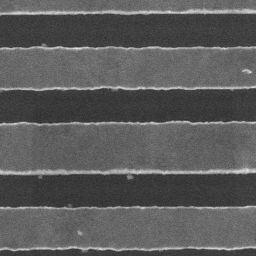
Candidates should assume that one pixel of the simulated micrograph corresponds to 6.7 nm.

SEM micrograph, lines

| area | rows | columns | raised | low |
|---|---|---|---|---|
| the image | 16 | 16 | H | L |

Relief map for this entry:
HHHHHHHHHHHHHHHH
LLLLLLLLLLLLLLLL
LLLLLLLLLLLLLLLL
HHHHHHHHHHHHHHHH
HHHHHHHHHHHHHHHH
HHHHHHHHHHHHHHHH
LLLLLLLLLLLLLLLL
LLLLLLLLLLLLLLLL
HHHHHHHHHHHHHHHH
HHHHHHHHHHHHHHHH
HHHHHHHHHHHHHHHH
LLLLLLLLLLLLLLLL
LLLLLLLLLLLLLLLL
HHHHHHHHHHHHHHHH
HHHHHHHHHHHHHHHH
HHHHHHHHHHHHHHHH